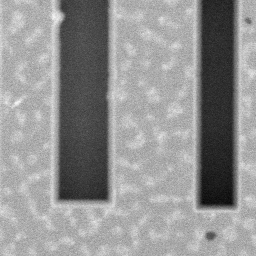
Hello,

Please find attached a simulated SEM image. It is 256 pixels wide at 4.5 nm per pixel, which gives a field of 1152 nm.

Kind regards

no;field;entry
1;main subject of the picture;one or a few lines or trenches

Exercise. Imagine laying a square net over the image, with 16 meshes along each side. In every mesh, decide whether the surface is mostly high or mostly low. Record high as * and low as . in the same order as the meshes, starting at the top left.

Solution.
****...*****...*
****...*****...*
***....*****...*
***....*****...*
***....*****...*
***....*****...*
***....*****...*
***....*****...*
***....*****...*
***....*****...*
***....*****...*
***....*****...*
****...*****...*
****************
****************
****************